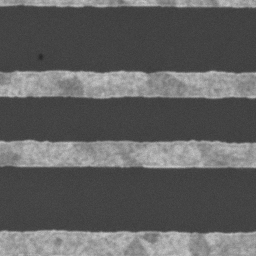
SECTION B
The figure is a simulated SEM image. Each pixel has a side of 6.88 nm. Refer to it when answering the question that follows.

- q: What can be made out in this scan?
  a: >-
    lines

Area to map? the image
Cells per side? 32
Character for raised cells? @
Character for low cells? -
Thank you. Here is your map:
@@@@@@@@@@@@@@@@@@@@@@@@@@@@@@@@
--------------------------------
--------------------------------
--------------------------------
--------------------------------
--------------------------------
--------------------------------
--------------------------------
--------------------------------
@@@@@@@@@@@@@@@@@@@@@@@@@@@@@@@@
@@@@@@@@@@@@@@@@@@@@@@@@@@@@@@@@
@@@@@@@@@@@@@@@@@@@@@@@@@@@@@@@@
--------------------------------
--------------------------------
--------------------------------
--------------------------------
--------------------------------
--------------------------------
@@@@@@@@@@@@@@@@@@@@@@@@@@@@@@@@
@@@@@@@@@@@@@@@@@@@@@@@@@@@@@@@@
@@@@@@@@@@@@@@@@@@@@@@@@@@@@@@@@
--------------------------------
--------------------------------
--------------------------------
--------------------------------
--------------------------------
--------------------------------
--------------------------------
--------------------------------
@@@@@@@@@@@@@@@@@@@@@@@@@@@@@@@@
@@@@@@@@@@@@@@@@@@@@@@@@@@@@@@@@
@@@@@@@@@@@@@@@@@@@@@@@@@@@@@@@@